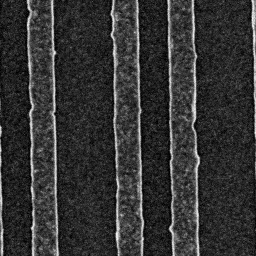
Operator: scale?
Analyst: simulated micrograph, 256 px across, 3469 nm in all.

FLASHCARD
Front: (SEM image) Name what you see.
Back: one or a few lines or trenches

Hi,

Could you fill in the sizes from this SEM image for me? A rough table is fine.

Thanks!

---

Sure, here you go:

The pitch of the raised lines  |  0.95 um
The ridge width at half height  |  335 nanometres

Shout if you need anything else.